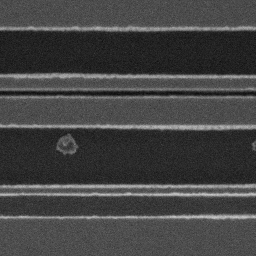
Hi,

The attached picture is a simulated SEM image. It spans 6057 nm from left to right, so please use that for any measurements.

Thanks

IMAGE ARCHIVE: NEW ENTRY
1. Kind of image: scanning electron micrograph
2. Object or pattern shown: lines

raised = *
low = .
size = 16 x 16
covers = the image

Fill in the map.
****************
****************
................
................
................
****************
****************
****************
................
................
................
................
****************
****************
****************
****************